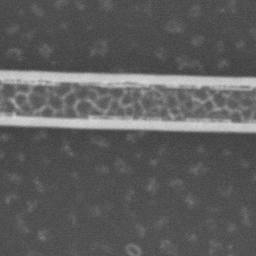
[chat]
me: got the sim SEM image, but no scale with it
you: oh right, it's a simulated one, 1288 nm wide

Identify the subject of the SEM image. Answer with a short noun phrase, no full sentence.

one or a few lines or trenches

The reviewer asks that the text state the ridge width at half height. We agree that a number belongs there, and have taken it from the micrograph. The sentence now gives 0.231 um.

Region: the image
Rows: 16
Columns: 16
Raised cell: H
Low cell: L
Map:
LLLLLLLLLLLLLLLL
LLLLLLLLLLLLLLLL
LLLLLLLLLLLLLLLL
LLLLLLLLLLLLLLLL
LLLLLLLLLLLLLLLL
HHHHHHHHHHHHHHHH
HHHHHHHHHHHHHHHH
HHHHHHHHHHHHHHHH
LLLLLLLLLLLLLLLL
LLLLLLLLLLLLLLLL
LLLLLLLLLLLLLLLL
LLLLLLLLLLLLLLLL
LLLLLLLLLLLLLLLL
LLLLLLLLLLLLLLLL
LLLLLLLLLLLLLLLL
LLLLLLLLLLLLLLLL